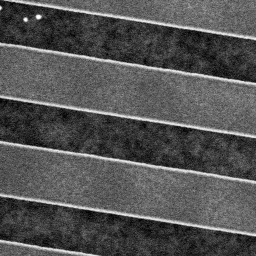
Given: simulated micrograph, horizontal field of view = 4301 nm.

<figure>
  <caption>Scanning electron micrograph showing lines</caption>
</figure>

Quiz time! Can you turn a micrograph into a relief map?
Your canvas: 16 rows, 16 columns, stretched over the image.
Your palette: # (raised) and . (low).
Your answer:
...#############
..........######
................
#####...........
###########.....
################
...#############
.........#######
...............#
####............
##########......
################
..##############
........########
..............##
###.............